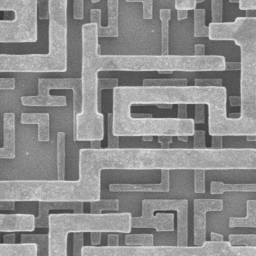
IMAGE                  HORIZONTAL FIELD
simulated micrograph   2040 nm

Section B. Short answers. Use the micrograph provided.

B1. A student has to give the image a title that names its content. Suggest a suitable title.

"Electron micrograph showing wiring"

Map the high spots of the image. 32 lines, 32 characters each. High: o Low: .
ooooo.oo..............oo......oo
..ooo.oo........................
.oooo.oo.....................ooo
ooooo.oo..oo..............oooooo
ooooo.oo..oo..............oooooo
......oo..oo..................oo
......oo..oo..................oo
oooooooo..oooooooooooooooooo..oo
oooooooo..oooooooooooooooooo..oo
..........oo..................oo
..........oo..................oo
..........oo..oooooooooooooo..oo
..........oo..oooooooooooooo..oo
..........oo..oo..........oo..oo
..........ooo.oo..........oo..oo
..........ooo.oooooooooo..oooooo
..........ooo.oooooooooo..oooooo
................................
................................
..........oooooooooooooooooooooo
..........oooooooooooooooooooooo
..........ooo...................
..........oo....................
oooooooooooo....................
oooooooooooo....................
................................
................................
oooo..oooooooooo................
oooo..oooooooooo................
......oo........................
o.oo..oo.................oooo...
ooooo.oo..oooooooooooooooooooooo